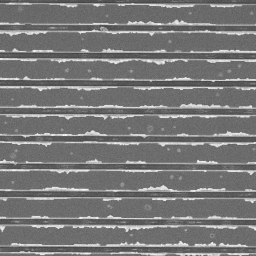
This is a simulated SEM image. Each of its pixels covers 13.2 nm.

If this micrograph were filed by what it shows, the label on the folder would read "parallel lines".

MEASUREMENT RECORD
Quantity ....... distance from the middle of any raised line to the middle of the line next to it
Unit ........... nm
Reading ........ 367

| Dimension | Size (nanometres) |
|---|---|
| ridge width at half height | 288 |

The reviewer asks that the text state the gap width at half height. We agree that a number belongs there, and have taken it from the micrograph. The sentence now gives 84.4 nanometers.